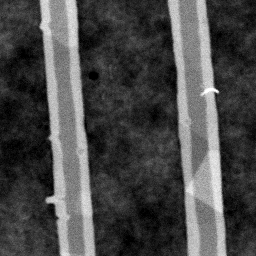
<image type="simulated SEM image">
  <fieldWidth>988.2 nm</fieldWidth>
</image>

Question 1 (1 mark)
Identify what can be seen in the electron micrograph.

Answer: one or a few lines or trenches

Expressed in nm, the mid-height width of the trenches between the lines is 401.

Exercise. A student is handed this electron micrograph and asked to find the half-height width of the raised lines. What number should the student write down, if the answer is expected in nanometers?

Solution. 102